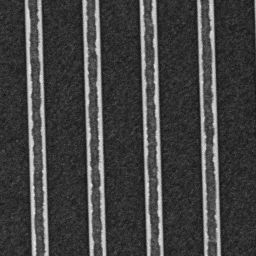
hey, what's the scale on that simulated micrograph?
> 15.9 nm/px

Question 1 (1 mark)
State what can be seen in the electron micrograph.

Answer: parallel lines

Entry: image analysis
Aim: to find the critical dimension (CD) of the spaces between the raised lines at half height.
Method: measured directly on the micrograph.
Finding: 698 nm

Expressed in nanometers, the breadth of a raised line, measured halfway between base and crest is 215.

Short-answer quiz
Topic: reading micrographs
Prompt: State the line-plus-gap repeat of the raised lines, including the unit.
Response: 0.915 microns